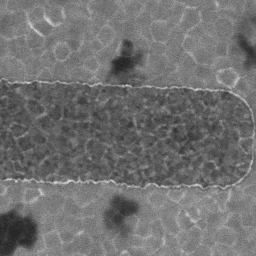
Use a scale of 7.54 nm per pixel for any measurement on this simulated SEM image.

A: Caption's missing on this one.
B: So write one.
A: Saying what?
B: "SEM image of one or a few lines or trenches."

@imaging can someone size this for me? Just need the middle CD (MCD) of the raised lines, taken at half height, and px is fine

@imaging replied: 98.5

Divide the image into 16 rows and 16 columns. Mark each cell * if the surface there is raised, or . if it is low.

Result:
................
................
................
................
................
************....
***************.
****************
****************
****************
****************
.......********.
................
................
................
................